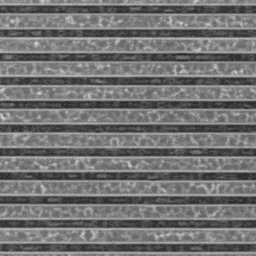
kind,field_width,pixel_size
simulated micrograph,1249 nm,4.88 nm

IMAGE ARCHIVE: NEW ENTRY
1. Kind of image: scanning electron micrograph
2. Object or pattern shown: parallel lines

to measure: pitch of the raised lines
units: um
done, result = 0.116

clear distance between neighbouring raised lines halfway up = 43.3 nm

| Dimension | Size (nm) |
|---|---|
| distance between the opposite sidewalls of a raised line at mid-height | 69.5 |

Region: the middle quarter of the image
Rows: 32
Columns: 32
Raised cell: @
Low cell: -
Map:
@@@@@@@@@@@@@@@@@@@@@@@@@@@@@@@@
@@@@@@@@@@@@@@@@@@@@@@@@@@@@@@@@
@@@@@@@@@@@@@@@@@@@@@@@@@@@@@@@@
--------------------------------
--------------------------------
@@@@@@@@@@@@------------@@@@@@@@
@@@@@@@@@@@@@@@@@@@@@@@@@@@@@@@@
@@@@@@@@@@@@@@@@@@@@@@@@@@@@@@@@
@@@@@@@@@@@@@@@@@@@@@@@@@@@@@@@@
--------------------------------
--------------------------------
@@@@@@@@@@@@@@@@@@@@@@@@@@@@@@@@
@@@@@@@@@@@@@@@@@@@@@@@@@@@@@@@@
@@@@@@@@@@@@@@@@@@@@@@@@@@@@@@@@
@@@@@@@@@@@@@@@@@@@@@@@@@@@@@@@@
--------------------------------
--------------------------------
@@@@@@@@@@@@@@@@@@@@@@@@@@@@@@@@
@@@@@@@@@@@@@@@@@@@@@@@@@@@@@@@@
@@@@@@@@@@@@@@@@@@@@@@@@@@@@@@@@
@@@@@@@@@@@@@@@@@@@@@@@@@@@@@@@@
--------------------------------
--------------------------------
@@@@@@@@@@@@@@@@@@@@@@@@@@@@@@@@
@@@@@@@@@@@@@@@@@@@@@@@@@@@@@@@@
@@@@@@@@@@@@@@@@@@@@@@@@@@@@@@@@
@@@@@@@@@@@@@@@@@@@@@@@@@@@@@@@@
--------------------------------
--------------------------------
@@@@@@@@@@@@@@@@@@@@@@@@@@@@@@@@
@@@@@@@@@@@@@@@@@@@@@@@@@@@@@@@@
@@@@@@@@@@@@@@@@@@@@@@@@@@@@@@@@